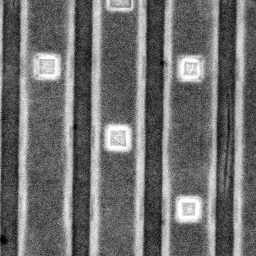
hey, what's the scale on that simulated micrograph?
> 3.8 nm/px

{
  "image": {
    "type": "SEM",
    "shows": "wiring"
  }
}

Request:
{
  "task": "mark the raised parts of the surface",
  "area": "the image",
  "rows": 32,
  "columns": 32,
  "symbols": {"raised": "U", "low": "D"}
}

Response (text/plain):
DDDUUUUUUDDDUUDDUUDDDUUUUUUDDDUU
DDDUUUUUUDDDUUUUUUDDDUUUUUUDDDUU
DDDUUUUUUDDDUUUUUUDDDUUUUUUDDDUU
DDDUUUUUUDDDUUUUUUDDDUUUUUUDDDUU
DDDUUUUUUDDDUUUUUUDDDUUUUUUDDDUU
DDDUUUUUUDDDUUUUUUDDDUUUUUUDDDUU
DDDUUUUUUDDDUUUUUUDDDUUUUUUDDDUU
DDDUUDDUUDDDUUUUUUDDDUUUUUUDDDUU
DDDUUDDUUDDDUUUUUUDDDUUDDUUDDDUU
DDDUUDUUUDDDUUUUUUDDDUUDDUUDDDUU
DDDUUUUUUDDDUUUUUUDDDUUUUUUDDDUU
DDDUUUUUUDDDUUUUUUDDDUUUUUUDDDUU
DDDUUUUUUDDDUUUUUUDDDUUUUUUDDDUU
DDDUUUUUUDDDUUUUUUDDDUUUUUUDDDUU
DDDUUUUUUDDDUUUUUUDDDUUUUUUDDDUU
DDDUUUUUUDDDUUUUUUDDDUUUUUUDDDUU
DDDUUUUUUDDDUUDDUUDDDUUUUUUDDDUU
DDDUUUUUUDDDUUDDUUDDDUUUUUUDDDUU
DDDUUUUUUDDDUUUUUUDDDUUUUUUDDDUU
DDDUUUUUUDDDUUUUUUDDDUUUUUUDDDUU
DDDUUUUUUDDDUUUUUUDDDUUUUUUDDDUU
DDDUUUUUUDDDUUUUUUDDDUUUUUUDDDUU
DDDUUUUUUDDDUUUUUUDDDUUUUUUDDDUU
DDDUUUUUUDDDUUUUUUDDDUUUUUUDDDUU
DDDUUUUUUDDDUUUUUUDDDUUUUUUDDDUU
DDDUUUUUUDDDUUUUUDDDDUUDDUDDDDUU
DDDUUUUUUDDDUUUUUDDDDUUDDUDDDDUU
DDDUUUUUUDDDUUUUUUDDDUUUUUUDDDUU
DDDUUUUUUDDDUUUUUUDDDUUUUUUDDDUU
DDDUUUUUUDDDUUUUUUDDDUUUUUUDDDUU
DDDUUUUUUDDDUUUUUUDDDUUUUUUDDDUU
DDDUUUUUUDDDUUUUUDDDDUUUUUUDDUUU